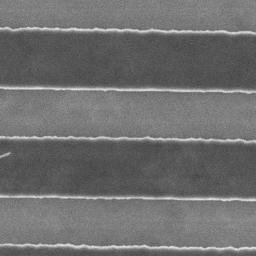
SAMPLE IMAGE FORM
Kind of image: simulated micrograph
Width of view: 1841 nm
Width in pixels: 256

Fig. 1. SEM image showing lines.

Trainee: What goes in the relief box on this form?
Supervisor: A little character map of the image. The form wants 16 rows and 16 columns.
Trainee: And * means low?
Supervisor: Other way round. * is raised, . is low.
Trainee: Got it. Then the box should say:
................
................
****************
****************
****************
****************
................
................
................
****************
****************
****************
.............***
................
................
****************